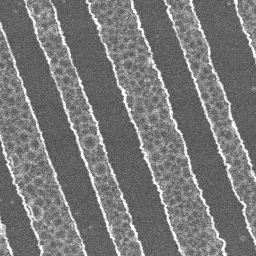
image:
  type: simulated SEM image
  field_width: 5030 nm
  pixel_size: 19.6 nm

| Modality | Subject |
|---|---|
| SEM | one or a few lines or trenches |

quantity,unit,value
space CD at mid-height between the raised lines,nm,627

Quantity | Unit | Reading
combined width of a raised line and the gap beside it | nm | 1280